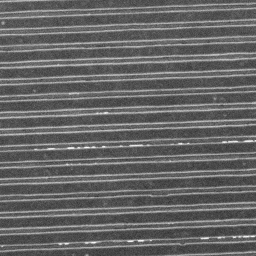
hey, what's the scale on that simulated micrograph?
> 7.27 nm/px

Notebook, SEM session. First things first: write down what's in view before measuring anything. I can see parallel lines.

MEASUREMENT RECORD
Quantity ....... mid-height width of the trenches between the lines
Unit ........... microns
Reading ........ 0.0345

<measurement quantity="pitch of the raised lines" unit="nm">121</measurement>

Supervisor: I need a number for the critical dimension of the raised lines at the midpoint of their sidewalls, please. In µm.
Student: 0.0889